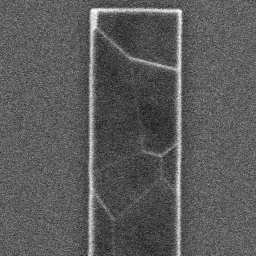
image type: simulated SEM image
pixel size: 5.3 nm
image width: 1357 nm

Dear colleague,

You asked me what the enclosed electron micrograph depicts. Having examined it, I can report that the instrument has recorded wiring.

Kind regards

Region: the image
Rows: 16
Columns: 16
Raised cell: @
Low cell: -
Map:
----------------
------@@@@@-----
------@@@@@-----
------@@@@@-----
------@@@@@-----
------@@@@@-----
------@@@@@-----
------@@@@@-----
------@@@@@-----
------@@@@@-----
------@@@@@-----
------@@@@@-----
------@@@@@-----
------@@@@@-----
------@@@@@-----
------@@@@@-----